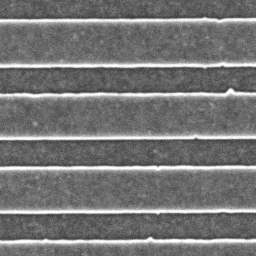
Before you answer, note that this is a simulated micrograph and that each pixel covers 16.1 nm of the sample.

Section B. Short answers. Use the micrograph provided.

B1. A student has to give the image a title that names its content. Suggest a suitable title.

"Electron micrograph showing one or a few lines or trenches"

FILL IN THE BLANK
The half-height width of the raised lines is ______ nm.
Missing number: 728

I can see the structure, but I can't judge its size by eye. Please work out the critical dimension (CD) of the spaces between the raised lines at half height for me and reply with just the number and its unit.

462 nm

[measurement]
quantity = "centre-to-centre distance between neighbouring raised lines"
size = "1180 nm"